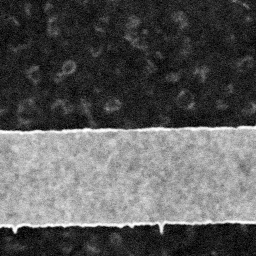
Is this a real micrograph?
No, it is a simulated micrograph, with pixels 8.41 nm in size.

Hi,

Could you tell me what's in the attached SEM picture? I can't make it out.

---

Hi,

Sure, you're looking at one or a few lines or trenches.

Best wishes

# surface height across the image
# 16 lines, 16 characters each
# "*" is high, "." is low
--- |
................
................
................
................
................
................
................
................
****************
****************
****************
****************
****************
****************
................
................